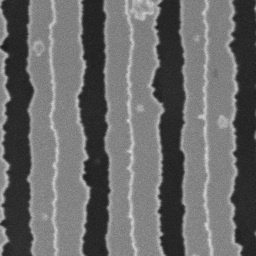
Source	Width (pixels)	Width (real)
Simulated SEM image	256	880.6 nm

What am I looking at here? lines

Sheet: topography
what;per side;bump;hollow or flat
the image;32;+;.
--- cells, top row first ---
....++++++...+++++++...++++++...
....++++++...+++++++...++++++...
+...++++++...+++++++...++++++...
+...++++++...+++++++..+++++++...
+...++++++...+++++++...++++++...
....++++++...+++++++...++++++...
+...++++++...+++++++...++++++...
+...++++++...+++++++...++++++...
+..++++++++..+++++++...+++++++..
+...++++++...++++++....++++++...
+...++++++...++++++....+++++++..
+...++++++...++++++....+++++++..
+...++++++...+++++++...++++++...
+...++++++...+++++++...++++++...
+...++++++...+++++++...++++++...
....++++++...+++++++...++++++...
....++++++...+++++++...++++++...
....+++++++..+++++++...++++++...
....+++++++..+++++++...++++++...
....+++++++...++++++...++++++...
+...++++++....++++++...++++++...
+...++++++....++++++...+++++++..
+...++++++....++++++...++++++...
+...+++++++...++++++...++++++...
....+++++++...++++++...++++++...
....+++++++...++++++...++++++...
....+++++++...++++++...++++++...
....+++++++...++++++...++++++...
....+++++++...++++++...++++++...
+...++++++...+++++++...++++++...
+...++++++...+++++++...+++++++..
....++++++....++++++...+++++++..